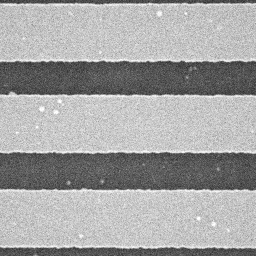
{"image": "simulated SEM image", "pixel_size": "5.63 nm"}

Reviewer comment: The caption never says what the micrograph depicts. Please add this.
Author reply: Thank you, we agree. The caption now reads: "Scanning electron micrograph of lines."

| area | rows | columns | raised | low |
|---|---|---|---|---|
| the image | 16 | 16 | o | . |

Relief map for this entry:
oooooooooooooooo
oooooooooooooooo
oooooooooooooooo
oooooooooooooooo
................
................
oooooooooooooooo
oooooooooooooooo
oooooooooooooooo
oooooooooooooooo
................
................
oooooooooooooooo
oooooooooooooooo
oooooooooooooooo
................